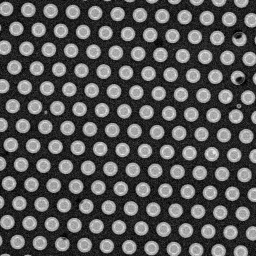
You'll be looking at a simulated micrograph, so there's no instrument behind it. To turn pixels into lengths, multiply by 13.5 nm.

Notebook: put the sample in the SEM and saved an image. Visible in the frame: an array of small figures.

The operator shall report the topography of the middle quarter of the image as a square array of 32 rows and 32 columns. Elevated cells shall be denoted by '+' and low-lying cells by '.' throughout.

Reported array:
...+++...++.....................
...+++..++++..+++...+++..+++...+
...+++..++++..+++..++++..+++...+
.........++...+++...+++..+++...+
................................
+++...++...+++...++.............
+++..++++..+++..++++..+++...+++.
+++..+++...+++..++++..+++...+++.
............+....++...+++...+++.
................................
..+++...+++...++....+...........
..++++..+++..++++..+++...+++..++
...++...+++..++++..+++...+++..++
...............+....++...+++..++
++..............................
+++..+++...+++..+++...++........
+++..+++..++++..+++...+++..+++..
++...+++...+++..+++...+++..+++..
......................++...+++..
..++............................
..+++..++++..+++...++....++.....
..+++..++++..+++..++++..+++...++
...+....++...+++...+++..+++...++
.........................++...++
++...++.........................
++..++++..+++...+++...++...++...
++..++++..+++...+++..+++...+++..
.....++....++...+++..+++...+++..
............................+...
..++...+++....+.................
.++++..+++...+++..+++...+++...++
.++++..+++..++++..+++...+++..+++